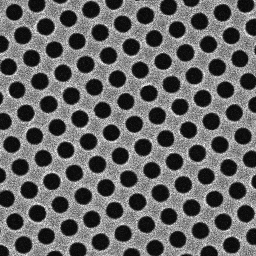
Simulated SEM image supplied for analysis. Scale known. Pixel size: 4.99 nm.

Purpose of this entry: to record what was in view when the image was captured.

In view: a regular array of holes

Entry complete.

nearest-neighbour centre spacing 0.121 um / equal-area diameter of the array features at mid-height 82.8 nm